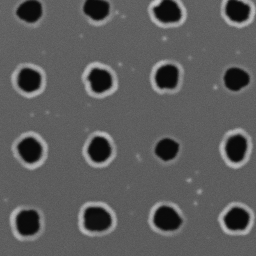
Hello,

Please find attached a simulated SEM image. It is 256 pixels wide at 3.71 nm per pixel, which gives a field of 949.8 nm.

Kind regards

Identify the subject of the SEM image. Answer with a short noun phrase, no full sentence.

a regular array of holes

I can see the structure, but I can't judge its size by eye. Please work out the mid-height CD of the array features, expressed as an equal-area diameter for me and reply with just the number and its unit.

87.4 nanometers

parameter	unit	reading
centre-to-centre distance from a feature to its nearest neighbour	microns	0.257